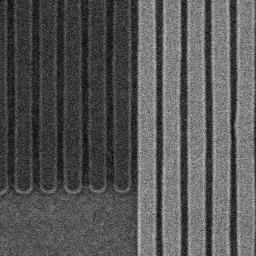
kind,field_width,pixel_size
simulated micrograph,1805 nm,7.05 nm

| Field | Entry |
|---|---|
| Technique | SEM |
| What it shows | parallel lines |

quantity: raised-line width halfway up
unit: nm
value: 113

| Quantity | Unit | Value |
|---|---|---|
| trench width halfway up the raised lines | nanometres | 62.5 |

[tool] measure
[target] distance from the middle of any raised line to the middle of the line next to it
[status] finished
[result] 174 nm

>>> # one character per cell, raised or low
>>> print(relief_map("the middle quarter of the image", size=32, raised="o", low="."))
oooo..oooo..oooo...oooo..oooo..o
oooo..oooo..oooo...oooo..oooo..o
oooo..oooo..oooo...oooo..oooo..o
oooo..oooo..oooo...oooo..oooo..o
oooo..oooo..ooooo..oooo..oooo..o
oooo..oooo..ooooo..oooo..oooo..o
oooo..oooo..oooo...oooo..oooo..o
oooo..oooo..oooo...oooo..oooo..o
oooo..oooo..oooo...oooo..oooo..o
oooo..oooo...ooo...oooo..oooo..o
oooo..oooo...ooo...oooo..oooo..o
oooo..oooo...ooo...oooo..oooo..o
oooo..oooo...ooo...oooo..oooo..o
oooo..oooo...ooo...oooo..oooo..o
oooo..oooo...ooo...oooo..oooo..o
oooo..oooo...ooo...oooo..oooo..o
oooo..oooo...ooo...oooo..oooo..o
oooo..oooo...ooo...oooo..oooo..o
oooo..oooo...ooo...oooo..oooo..o
oooo..oooo...ooo...oooo..oooo..o
oooo..oooo...ooo...oooo..oooo..o
oooo..oooo...ooo...oooo..oooo..o
oooo..oooo...ooo...oooo..oooo..o
oooo..oooo...ooo...oooo..oooo..o
oooo...ooo...oooo..oooo..oooo..o
oooo...ooo...oooo..oooo..oooo..o
oooo...ooo...ooo...oooo..oooo..o
oooo...ooo...ooo...oooo..oooo..o
oooo...ooo...oooo..oooo..oooo..o
oooo...ooo...oooo..oooo..oooo..o
oooo...ooo...oooo..oooo..oooo..o
.ooo...ooo...ooo...oooo..oooo..o